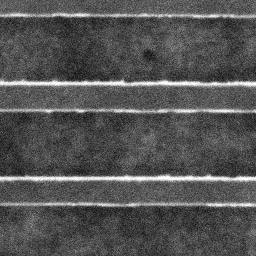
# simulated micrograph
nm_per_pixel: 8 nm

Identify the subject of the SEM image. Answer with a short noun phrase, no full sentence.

lines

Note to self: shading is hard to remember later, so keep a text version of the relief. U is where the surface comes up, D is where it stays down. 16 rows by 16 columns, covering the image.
UUUUUUUUUUUUUUUU
DDDDDDDDDDDDDDDD
DDDDDDDDDDDDDDDD
DDDDDDDDDDDDDDDD
DDDDDDDDDDDDDDDD
UUUUUUUUUUUUUUUU
UUUUUUUUUUUUUUUU
DDDDDDDDDDDDDDDD
DDDDDDDDDDDDDDDD
DDDDDDDDDDDDDDDD
DDDDDDDDDDDDDDDD
UUUUUUUUUUUUUUUU
UUUUUUUUUUUUUUUU
DDDDDDDDDDDDDDDD
DDDDDDDDDDDDDDDD
DDDDDDDDDDDDDDDD